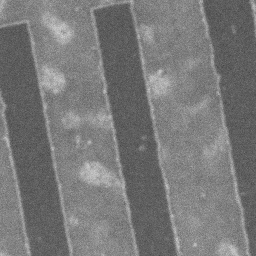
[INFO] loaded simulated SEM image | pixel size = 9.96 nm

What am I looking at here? one or a few lines or trenches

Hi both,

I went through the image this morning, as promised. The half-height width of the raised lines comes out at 0.409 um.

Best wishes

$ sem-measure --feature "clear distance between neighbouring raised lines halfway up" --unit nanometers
671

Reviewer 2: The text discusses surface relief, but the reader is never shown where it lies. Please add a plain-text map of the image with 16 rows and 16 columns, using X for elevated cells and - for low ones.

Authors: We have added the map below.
------XX-----XXX
------XX-----XXX
XX----XXX----XXX
XX----XXX----XXX
XX----XXX----XXX
XXX----XX-----XX
XXX----XX-----XX
XXX----XXX----XX
XXX----XXX----XX
-XX----XXX----XX
-XX----XXX-----X
-XXX----XX-----X
-XXX----XXX----X
-XXX----XXX----X
--XX----XXX----X
--XX----XXX----X